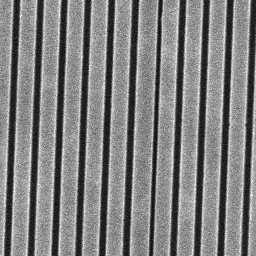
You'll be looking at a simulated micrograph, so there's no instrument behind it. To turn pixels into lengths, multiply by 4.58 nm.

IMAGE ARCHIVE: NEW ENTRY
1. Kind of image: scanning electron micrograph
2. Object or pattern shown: parallel lines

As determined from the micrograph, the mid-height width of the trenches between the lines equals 31.4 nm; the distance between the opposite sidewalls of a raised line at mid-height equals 78.3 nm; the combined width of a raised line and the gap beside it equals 108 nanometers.